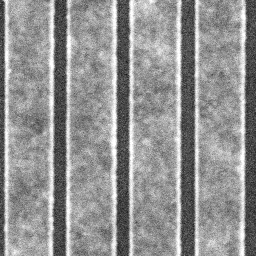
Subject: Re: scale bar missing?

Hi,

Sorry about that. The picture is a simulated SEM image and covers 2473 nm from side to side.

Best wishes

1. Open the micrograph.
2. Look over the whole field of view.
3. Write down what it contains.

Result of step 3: lines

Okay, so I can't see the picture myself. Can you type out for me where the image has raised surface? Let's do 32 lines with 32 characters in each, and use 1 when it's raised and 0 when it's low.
01111110011111001111110001111100
01111110011111001111110001111100
01111110011111001111110001111100
01111110011111001111110001111100
01111110011111001111110001111100
01111110011111001111110001111100
01111100011111001111110001111100
01111110011111001111110001111100
01111110011111001111110001111100
01111110011111001111110001111100
01111110011111001111110001111100
01111110011111001111110001111100
01111100011111001111110001111100
01111100011111001111110001111100
01111100011111001111110001111100
01111100111111001111110001111100
01111100111111001111110001111100
01111100111111001111110001111100
01111100111111001111110001111100
01111100111111001111110001111100
01111100111111001111110001111100
01111100111111001111110001111100
01111100111111001111110001111100
01111100111111001111110001111100
01111100111111001111110001111100
01111100111111001111110001111100
01111100111111001111110001111100
01111100111111001111110001111100
01111100111111001111110001111100
01111100111111001111110001111100
01111100111111001111110001111100
01111100111111001111110001111100